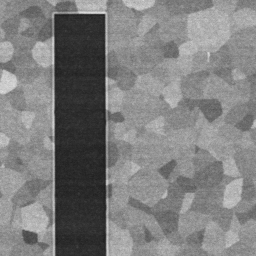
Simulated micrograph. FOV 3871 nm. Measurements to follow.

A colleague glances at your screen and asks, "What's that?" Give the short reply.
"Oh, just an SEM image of one or a few lines or trenches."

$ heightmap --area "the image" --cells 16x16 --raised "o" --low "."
oooooooooooooooo
ooo....ooooooooo
ooo....ooooooooo
ooo....ooooooooo
ooo....ooooooooo
ooo....ooooooooo
ooo....ooooooooo
ooo....ooooooooo
ooo....ooooooooo
ooo....ooooooooo
ooo....ooooooooo
ooo....ooooooooo
ooo....ooooooooo
ooo....ooooooooo
ooo....ooooooooo
ooo....ooooooooo